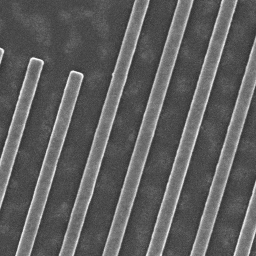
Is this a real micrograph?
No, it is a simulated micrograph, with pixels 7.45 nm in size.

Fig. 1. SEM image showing parallel lines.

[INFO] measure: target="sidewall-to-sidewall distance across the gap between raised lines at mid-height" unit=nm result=212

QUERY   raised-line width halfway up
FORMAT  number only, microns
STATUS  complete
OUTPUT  0.103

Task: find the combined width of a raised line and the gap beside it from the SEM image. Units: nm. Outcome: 312